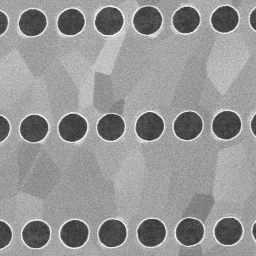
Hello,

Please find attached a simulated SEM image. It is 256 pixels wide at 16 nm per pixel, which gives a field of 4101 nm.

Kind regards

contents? a regular array of holes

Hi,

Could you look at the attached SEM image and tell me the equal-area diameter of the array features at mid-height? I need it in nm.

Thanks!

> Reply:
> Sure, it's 459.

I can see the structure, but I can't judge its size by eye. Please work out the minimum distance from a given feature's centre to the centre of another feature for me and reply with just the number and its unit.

614 nm